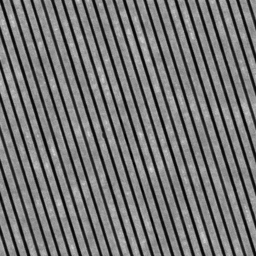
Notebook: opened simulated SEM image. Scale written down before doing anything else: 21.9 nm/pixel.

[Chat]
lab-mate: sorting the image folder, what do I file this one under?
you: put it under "parallel lines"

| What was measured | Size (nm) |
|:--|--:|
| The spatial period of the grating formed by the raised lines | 215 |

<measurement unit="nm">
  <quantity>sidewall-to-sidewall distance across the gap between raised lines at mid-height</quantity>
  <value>73.3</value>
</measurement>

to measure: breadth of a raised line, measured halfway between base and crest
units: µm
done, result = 0.149